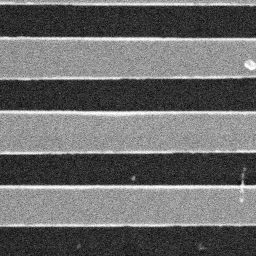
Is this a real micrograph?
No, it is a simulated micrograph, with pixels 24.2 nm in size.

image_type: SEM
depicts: lines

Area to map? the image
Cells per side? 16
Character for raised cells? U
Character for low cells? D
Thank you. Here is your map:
DDDDDDDDDDDDDDDD
DDDDDDDDDDDDDDDD
UUUUUUUUUUUUUUUU
UUUUUUUUUUUUUUUU
UUUUUUUUUUUUUUUU
DDDDDDDDDDDDDDDD
DDDDDDDDDDDDDDDD
UUUUUUUUUUUUUUUU
UUUUUUUUUUUUUUUU
UUUUUUUUUUUDUDDD
DDDDDDDDDDDDDDDD
DDDDDDDDDDDDDDDD
UUUUUUUUUUUUUUUU
UUUUUUUUUUUUUUUU
DDDDDDDDDDDDDDDD
DDDDDDDDDDDDDDDD